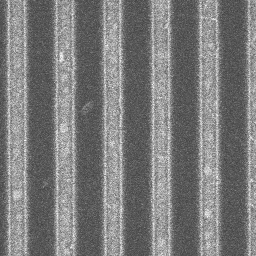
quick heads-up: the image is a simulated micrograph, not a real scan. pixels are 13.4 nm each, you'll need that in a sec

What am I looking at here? parallel lines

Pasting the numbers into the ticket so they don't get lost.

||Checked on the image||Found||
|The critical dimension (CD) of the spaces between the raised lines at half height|205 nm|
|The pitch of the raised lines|644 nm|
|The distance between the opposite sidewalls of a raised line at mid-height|446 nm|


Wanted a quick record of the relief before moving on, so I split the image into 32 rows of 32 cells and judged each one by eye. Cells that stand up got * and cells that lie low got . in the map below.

*..****..****..****..****..****.
*..****..****..****..****..****.
*..****..****..****..****..****.
*..****..****..****..****..****.
*..****..****..****..****..****.
*..****..****..****..****..****.
*..****..****..****..****..****.
*..****..****..****..****..****.
*..****..****..****..****..****.
*..****..****..****..****..****.
*..****..****..****..****..****.
*..****..****..****..****..****.
*..****..****..****..****..****.
*..****..****..****..****..****.
*..****..****..****..****..****.
*..****..****..****..****..****.
*..****..****..****..****..****.
*..****..****..****..****..****.
*..****..****..****..****..****.
*..****..****..****..****..****.
*..****..****..****..****..****.
*..****..****..****..****..****.
*..****..****..****..****..****.
*..****..****..****..****..****.
*..****..****..****..****..****.
*..****..****..****..****..****.
*..****..****..****..****..****.
*..****..****..****..****..****.
*..****..****..****..****..****.
*..****..****..****..****..****.
*..****..****..****..****..****.
*..****..****..****..****..****.